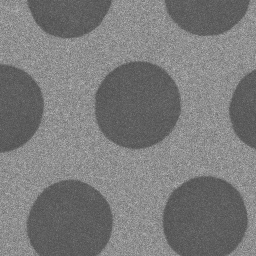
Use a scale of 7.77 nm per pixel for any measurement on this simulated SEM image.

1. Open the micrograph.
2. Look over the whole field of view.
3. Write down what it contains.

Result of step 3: holes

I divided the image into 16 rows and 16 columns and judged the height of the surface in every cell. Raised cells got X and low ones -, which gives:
XX-----XXX-----X
XX----XXXXX----X
XXXXXXXXXXXXXXXX
XXXXXXXXXXXXXXXX
--XXXXX---XXXXXX
--XXXX-----XXXX-
---XXX-----XXX--
---XXX-----XXX--
--XXXXX---XXXXX-
XXXXXXXXXXXXXXXX
XXXXXXXXXXXXXXXX
XXX--XXXXXX---XX
XX-----XXXX----X
XX-----XXX-----X
XX-----XXX-----X
XX----XXXXX----X